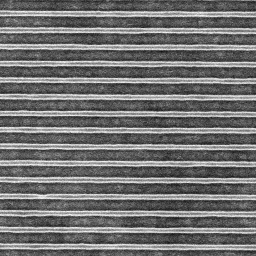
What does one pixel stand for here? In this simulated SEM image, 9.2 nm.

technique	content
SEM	parallel lines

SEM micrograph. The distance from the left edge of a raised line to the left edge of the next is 153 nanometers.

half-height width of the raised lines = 39.1 nm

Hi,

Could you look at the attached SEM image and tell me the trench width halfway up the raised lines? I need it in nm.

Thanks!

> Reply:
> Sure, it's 109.